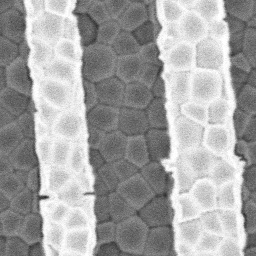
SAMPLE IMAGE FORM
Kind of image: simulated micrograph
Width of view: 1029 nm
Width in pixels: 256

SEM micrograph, one or a few lines or trenches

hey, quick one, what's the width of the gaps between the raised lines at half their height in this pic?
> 83 px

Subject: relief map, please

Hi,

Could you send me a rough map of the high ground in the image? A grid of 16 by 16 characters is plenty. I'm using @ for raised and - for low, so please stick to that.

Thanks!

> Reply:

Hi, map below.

--@@@-----@@@@--
--@@@-----@@@@--
--@@@-----@@@@--
--@@@-----@@@@--
--@@@-----@@@@--
--@@@-----@@@@--
--@@@-----@@@@@-
--@@@------@@@--
--@@@------@@@@-
--@@@------@@@@-
---@@@----@@@@@-
---@@@-----@@@@-
---@@@-----@@@@-
---@@@-----@@@@-
---@@@-----@@@@-
---@@@-----@@@@-